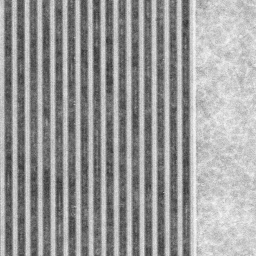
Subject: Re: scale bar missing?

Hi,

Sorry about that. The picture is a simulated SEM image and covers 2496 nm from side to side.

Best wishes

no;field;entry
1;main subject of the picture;parallel lines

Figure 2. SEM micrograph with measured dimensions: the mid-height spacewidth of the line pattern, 0.078 um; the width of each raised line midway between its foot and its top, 43.9 nanometers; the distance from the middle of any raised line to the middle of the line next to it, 124 nanometers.